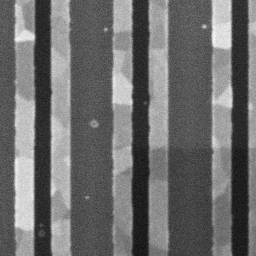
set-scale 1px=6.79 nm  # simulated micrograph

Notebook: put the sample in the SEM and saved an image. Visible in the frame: lines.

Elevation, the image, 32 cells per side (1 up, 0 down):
00110011100000110001100000011001
00110011100000110001100000011001
00110011100000110001100000011001
00110011100000110001100000011001
00110011100000110001100000011001
00110011100000110001100000011001
00110011100000110001100000011001
00110011100000110001100000011001
00110011100000110001100000011001
00110011100000110001100000011001
00110011100000110001100000011001
00110011100000110001100000011001
00110011100000110001100000011001
00110011100000110001100000011001
00110011100000110001100000011001
00110011100000110001100000011001
00110011100000110001100000011001
00110011100000110001100000011001
00110011100000110001100000011001
00110011100000110001100000011001
00110011100000110001100000011001
00110011100000110001100000011001
00110011100000110001100000011001
00110011100000110001100000011001
00110011100000110001100000011001
00110011100000110001100000011001
00110011100000110001100000011001
00110011100000110001100000011001
00110011100000110001100000011001
00110011100000110001100000011001
00110011100000110001100000011001
00110011100000110001100000011001